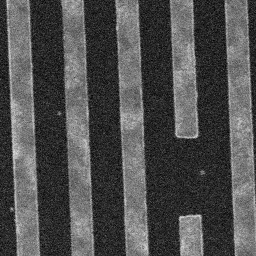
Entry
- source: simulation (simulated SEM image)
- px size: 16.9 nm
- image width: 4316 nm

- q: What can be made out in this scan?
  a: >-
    parallel lines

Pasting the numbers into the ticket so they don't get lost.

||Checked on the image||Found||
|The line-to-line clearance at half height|562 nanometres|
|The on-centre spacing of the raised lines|918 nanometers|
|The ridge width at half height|360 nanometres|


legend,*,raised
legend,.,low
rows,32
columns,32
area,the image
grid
.***....**.....**....***....***.
.***....**.....**....***....***.
.***....**.....**....***....***.
.***....***....**.....**....***.
.***....***....**.....**....***.
.***....***....**.....**....***.
.***....***....**.....**.....**.
.***....***....***....**.....**.
.***....***....**.....**.....**.
.***....***....***....**.....**.
.***....***....***....**.....**.
.***....***....***....***....**.
.***....***....***....***....**.
.***....***....***....***....**.
..**....***....***....***....**.
..**....***....***....***....**.
..**....***....***....***....***
..**.....**....***...........***
..**.....**....***...........***
..**.....**....***...........***
..**.....**....***...........***
..**.....**.....**...........***
..**.....**.....**...........***
..**.....**.....**...........***
..***....**.....**...........***
..***....**.....**...........***
..***....**.....**...........***
..***....***....**.....**....***
..***....***....**.....**....***
..***....***....**.....**....***
..***....***....**.....**....***
..***....***....**.....**....***